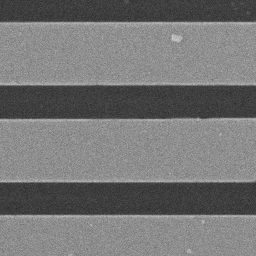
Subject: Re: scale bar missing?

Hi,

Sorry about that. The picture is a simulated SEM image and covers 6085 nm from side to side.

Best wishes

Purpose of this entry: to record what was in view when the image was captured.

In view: lines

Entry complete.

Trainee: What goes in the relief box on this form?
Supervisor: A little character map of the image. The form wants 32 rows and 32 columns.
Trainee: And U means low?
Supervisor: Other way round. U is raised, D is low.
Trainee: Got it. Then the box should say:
DDDDDDDDDDDDDDDDDDDDDDDDDDDDDDDD
DDDDDDDDDDDDDDDDDDDDDDDDDDDDDDDD
DDDDDDDDDDDDDDDDDDDDDDDDDDDDDDDD
UUUUUUUUUUUUUUUUUUUUUUUUUUUUUUUU
UUUUUUUUUUUUUUUUUUUUUUUUUUUUUUUU
UUUUUUUUUUUUUUUUUUUUUUUUUUUUUUUU
UUUUUUUUUUUUUUUUUUUUUUUUUUUUUUUU
UUUUUUUUUUUUUUUUUUUUUUUUUUUUUUUU
UUUUUUUUUUUUUUUUUUUUUUUUUUUUUUUU
UUUUUUUUUUUUUUUUUUUUUUUUUUUUUUUU
UUUUUUUUUUUUUUUUUUUUUUUUUUUUUUUU
DDDDDDDDDDDDDDDDDDDDDDDDDDDDDDDD
DDDDDDDDDDDDDDDDDDDDDDDDDDDDDDDD
DDDDDDDDDDDDDDDDDDDDDDDDDDDDDDDD
DDDDDDDDDDDDDDDDDDDDDDDDDDDDDDDD
UUUUUUUUUUUUUUUUUUUUUUUUUUUUUUUU
UUUUUUUUUUUUUUUUUUUUUUUUUUUUUUUU
UUUUUUUUUUUUUUUUUUUUUUUUUUUUUUUU
UUUUUUUUUUUUUUUUUUUUUUUUUUUUUUUU
UUUUUUUUUUUUUUUUUUUUUUUUUUUUUUUU
UUUUUUUUUUUUUUUUUUUUUUUUUUUUUUUU
UUUUUUUUUUUUUUUUUUUUUUUUUUUUUUUU
UUUUUUUUUUUUUUUUUUUUUUUUUUUUUUUU
DDDDDDDDDDDDDDDDDDDDDDDDDDDDDDDD
DDDDDDDDDDDDDDDDDDDDDDDDDDDDDDDD
DDDDDDDDDDDDDDDDDDDDDDDDDDDDDDDD
DDDDDDDDDDDDDDDDDDDDDDDDDDDDDDDD
UUUUUUUUUUUUUUUUUUUUUUUUUUUUUUUU
UUUUUUUUUUUUUUUUUUUUUUUUUUUUUUUU
UUUUUUUUUUUUUUUUUUUUUUUUUUUUUUUU
UUUUUUUUUUUUUUUUUUUUUUUUUUUUUUUU
UUUUUUUUUUUUUUUUUUUUUUUUUUUUUUUU